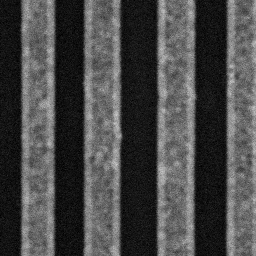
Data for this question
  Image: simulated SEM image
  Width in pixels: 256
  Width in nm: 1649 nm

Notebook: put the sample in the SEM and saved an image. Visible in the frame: one or a few lines or trenches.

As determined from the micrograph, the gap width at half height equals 256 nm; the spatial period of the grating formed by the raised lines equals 69.1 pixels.